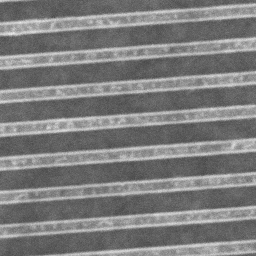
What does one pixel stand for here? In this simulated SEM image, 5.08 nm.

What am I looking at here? parallel lines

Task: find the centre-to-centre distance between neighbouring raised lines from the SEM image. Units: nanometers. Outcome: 171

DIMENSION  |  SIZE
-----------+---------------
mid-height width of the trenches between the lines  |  114 nm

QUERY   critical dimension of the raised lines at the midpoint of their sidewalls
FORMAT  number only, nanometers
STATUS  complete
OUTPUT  54.4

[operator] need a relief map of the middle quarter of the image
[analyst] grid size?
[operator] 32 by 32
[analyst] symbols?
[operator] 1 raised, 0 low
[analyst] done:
00000000000000000000000000000000
00000000000000000000000000000000
00000000000000000000000000000000
00000000000000000000000000000111
00000000000000011111111111111111
00111111111111111111111111111111
11111111111111111111111110000000
11111111111100000000000000000000
00000000000000000000000000000000
00000000000000000000000000000000
00000000000000000000000000000000
00000000000000000000000000000000
00000000000000000000001111111111
00000000011111111111111111111111
11111111111111111111111111111000
11111111111111110000000000000000
11000000000000000000000000000000
00000000000000000000000000000000
00000000000000000000000000000000
00000000000000000000000000000000
00000000000000000000000000111111
00000000000001111111111111111111
11111111111111111111111111111111
11111111111111111111111000000000
11111111100000000000000000000000
00000000000000000000000000000000
00000000000000000000000000000000
00000000000000000000000000000000
00000000000000000000000000000000
00000000000000000000111111111111
00000001111111111111111111111111
11111111111111111111111111100000